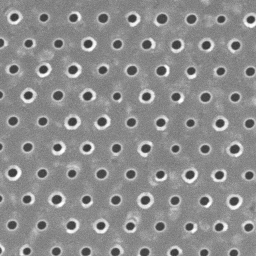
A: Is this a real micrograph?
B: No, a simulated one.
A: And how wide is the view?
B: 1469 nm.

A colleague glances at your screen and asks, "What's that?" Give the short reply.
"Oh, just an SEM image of a regular array of holes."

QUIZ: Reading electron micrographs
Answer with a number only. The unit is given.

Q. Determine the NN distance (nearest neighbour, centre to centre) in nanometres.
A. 169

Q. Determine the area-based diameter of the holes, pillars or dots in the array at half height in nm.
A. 54.9